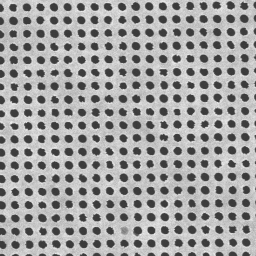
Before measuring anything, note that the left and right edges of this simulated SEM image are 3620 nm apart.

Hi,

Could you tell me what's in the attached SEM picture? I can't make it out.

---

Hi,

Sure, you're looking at a regular array of holes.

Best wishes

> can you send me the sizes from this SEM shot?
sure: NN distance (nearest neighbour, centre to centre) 0.184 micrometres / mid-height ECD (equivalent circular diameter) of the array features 0.112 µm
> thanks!